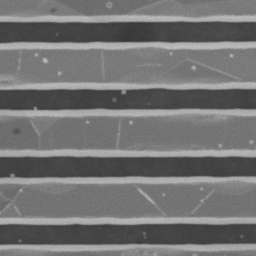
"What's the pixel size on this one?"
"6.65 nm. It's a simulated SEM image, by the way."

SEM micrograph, wiring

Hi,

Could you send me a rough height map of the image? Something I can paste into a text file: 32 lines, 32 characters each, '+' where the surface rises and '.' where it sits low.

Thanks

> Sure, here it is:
++++++++++++++++++++++++++++++++
++++++++++++++++++++++++++++++++
................................
................................
................................
................................
++++++++++++++++++++++++++++++++
++++++++++++++++++++++++++++++++
++++++++++++++++++++++++++++++++
++++++++++++++++++++++++++++++++
++++++++++++++++++++++++++++++++
................................
................................
................................
++++++++++++++++++++++++++++++++
++++++++++++++++++++++++++++++++
++++++++++++++++++++++++++++++++
++++++++++++++++++++++++++++++++
++++++++++++++++++++++++++++++++
................................
................................
................................
................................
++++++++++++++++++++++++++++++++
++++++++++++++++++++++++++++++++
++++++++++++++++++++++++++++++++
++++++++++++++++++++++++++++++++
++++++++++++++++++++++++++++++++
................................
................................
................................
++++++++++++++++++++++++++++++++